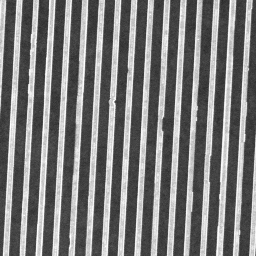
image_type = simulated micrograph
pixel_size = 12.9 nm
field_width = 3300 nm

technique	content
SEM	parallel lines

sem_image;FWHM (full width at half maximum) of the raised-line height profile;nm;64.3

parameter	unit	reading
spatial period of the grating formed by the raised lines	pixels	16.4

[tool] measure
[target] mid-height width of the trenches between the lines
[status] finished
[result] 153 nanometers